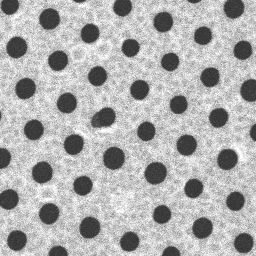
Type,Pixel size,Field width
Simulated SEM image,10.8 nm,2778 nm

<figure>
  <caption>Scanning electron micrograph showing a regular array of holes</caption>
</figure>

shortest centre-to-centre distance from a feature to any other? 452 nanometers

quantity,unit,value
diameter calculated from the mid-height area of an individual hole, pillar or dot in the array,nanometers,224